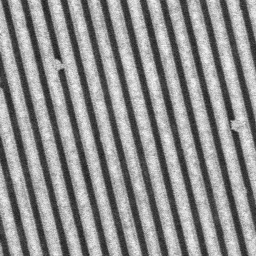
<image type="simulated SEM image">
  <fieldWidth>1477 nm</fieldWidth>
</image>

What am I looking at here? parallel lines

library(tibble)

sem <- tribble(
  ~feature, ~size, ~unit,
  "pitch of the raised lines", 0.111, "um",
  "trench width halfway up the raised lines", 0.0427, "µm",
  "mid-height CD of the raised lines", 0.0687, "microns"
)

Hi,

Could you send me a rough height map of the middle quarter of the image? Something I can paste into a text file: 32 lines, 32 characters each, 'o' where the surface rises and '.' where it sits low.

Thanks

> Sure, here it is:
ooo..ooo..ooo..ooo..ooo..ooo..oo
ooo..ooo..ooo..ooo..ooo..ooo..oo
ooo...oo..ooo..ooo..ooo..ooo..oo
.ooo..ooo..ooo..ooo..ooo.oooo.oo
.ooo..ooo..ooo..ooo..ooo..ooo..o
.ooo..ooo..ooo..ooo..ooo..ooo..o
.ooo..ooo..ooo..ooo..ooo..ooo..o
..ooo..ooo..ooo..ooo.ooo..ooo..o
..ooo..ooo..ooo..ooo..ooo..oo...
..ooo..ooo..ooo..ooo..ooo..ooo..
..ooo..ooo..ooo..ooo..ooo..ooo..
o..ooo..ooo..ooo.ooo..ooo..ooo..
o..ooo..ooo..ooo..ooo..oo...oo..
o..ooo..ooo..ooo..ooo..ooo..ooo.
o..ooo...oo..ooo..ooo..ooo..ooo.
oo..ooo..ooo.ooo..ooo..ooo..ooo.
oo..ooo..ooo..ooo..ooo..oo...oo.
oo..ooo..ooo..ooo..ooo..ooo..ooo
oo..ooo..ooo..ooo..ooo..ooo..ooo
ooo..ooo.ooo..ooo..ooo..ooo..ooo
ooo..ooo..ooo..oo...ooo..ooo..oo
ooo..ooo..ooo..ooo..ooo..ooo..oo
ooo..ooo..ooo..ooo..ooo..ooo..oo
.ooo..oo..ooo..ooo..ooo..ooo..oo
.ooo..ooo..ooo..ooo..ooo..ooo..o
.ooo..ooo..ooo..ooo..ooo..ooo..o
.ooo..ooo..ooo..ooo..ooo..ooo..o
..oo...oo..ooo..ooo..ooo..ooo..o
..ooo..ooo..ooo..ooo..ooo..ooo..
..ooo..ooo..ooo..ooo..ooo..ooo..
..ooo..ooo..ooo..ooo..ooo..ooo..
...oo...oo..ooo..ooo..ooo..ooo..